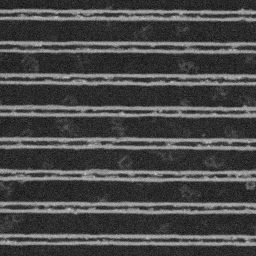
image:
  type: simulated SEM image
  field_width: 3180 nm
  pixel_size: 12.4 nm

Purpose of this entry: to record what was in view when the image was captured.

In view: parallel lines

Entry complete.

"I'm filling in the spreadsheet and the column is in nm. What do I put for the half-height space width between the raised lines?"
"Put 301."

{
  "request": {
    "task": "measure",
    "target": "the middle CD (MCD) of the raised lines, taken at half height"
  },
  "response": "96.3 nm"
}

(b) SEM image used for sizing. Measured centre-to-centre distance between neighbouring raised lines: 399 nanometers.